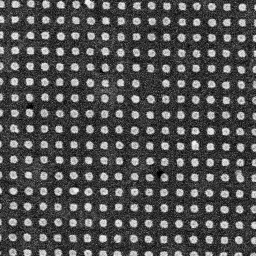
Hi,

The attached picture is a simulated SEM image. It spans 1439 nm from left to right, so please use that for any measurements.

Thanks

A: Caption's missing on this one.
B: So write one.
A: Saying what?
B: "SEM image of a regular array of raised bodies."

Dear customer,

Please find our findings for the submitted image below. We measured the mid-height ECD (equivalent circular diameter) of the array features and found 39.6 nm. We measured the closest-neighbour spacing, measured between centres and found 82.9 nm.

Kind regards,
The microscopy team